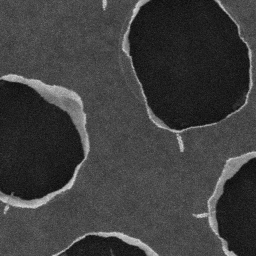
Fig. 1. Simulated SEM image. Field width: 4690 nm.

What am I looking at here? holes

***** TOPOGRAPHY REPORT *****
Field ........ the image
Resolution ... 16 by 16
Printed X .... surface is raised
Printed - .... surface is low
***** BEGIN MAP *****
XXXXXXXXX-----XX
XXXXXXXX-------X
XXXXXXXX-------X
XXXXXXXX--------
XXXXXXXX--------
--XXXXXXX-------
-----XXXX------X
-----XXXXX----XX
-----XXXXXXXXXXX
-----XXXXXXXXXXX
-----XXXXXXXXXX-
----XXXXXXXXXX--
X-XXXXXXXXXXX---
XXXXXXXXXXXXX---
XXXXXXXXXXXXXX--
XXXX-----XXXXX--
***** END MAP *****